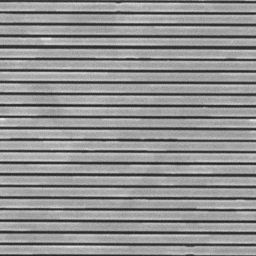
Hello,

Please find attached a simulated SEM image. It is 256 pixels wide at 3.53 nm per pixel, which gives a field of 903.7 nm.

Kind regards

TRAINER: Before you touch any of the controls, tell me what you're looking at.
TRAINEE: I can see parallel lines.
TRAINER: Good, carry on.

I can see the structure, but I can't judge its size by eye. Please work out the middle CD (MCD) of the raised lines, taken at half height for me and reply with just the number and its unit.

0.0296 µm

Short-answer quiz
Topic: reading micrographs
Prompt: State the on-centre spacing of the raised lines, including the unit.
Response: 0.0409 µm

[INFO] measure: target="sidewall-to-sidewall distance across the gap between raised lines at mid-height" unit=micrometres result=0.0115